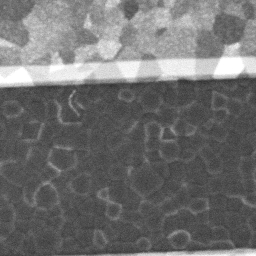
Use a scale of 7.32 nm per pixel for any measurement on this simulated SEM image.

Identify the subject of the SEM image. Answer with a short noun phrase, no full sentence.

one or a few lines or trenches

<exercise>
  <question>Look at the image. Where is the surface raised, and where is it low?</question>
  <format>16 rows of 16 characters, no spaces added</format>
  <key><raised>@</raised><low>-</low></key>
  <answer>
@@@@@@@@@@@@@@@@
@@@@@@@@@@@@@@@@
@@@@@@@@@@@@@@@@
@@@@@@@@@@@@@@@@
@@@@@-----------
----------------
----------------
----------------
----------------
----------------
----------------
----------------
----------------
----------------
----------------
----------------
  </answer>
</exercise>